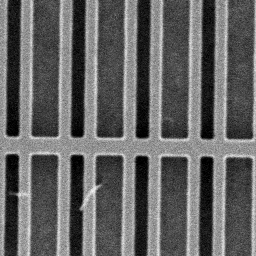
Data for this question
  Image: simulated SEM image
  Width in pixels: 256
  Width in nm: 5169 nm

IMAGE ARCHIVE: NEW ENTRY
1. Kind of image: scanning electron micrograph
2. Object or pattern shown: groups of lines, slits or small figures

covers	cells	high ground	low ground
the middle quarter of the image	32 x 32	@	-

@@---@@@-------@@@----@@-------@
@@---@@@-------@@@----@@-------@
@@---@@@-------@@@----@@-------@
@@---@@@-------@@@----@@-------@
@@---@@@-------@@@----@@-------@
@@---@@@-------@@@----@@-------@
@@---@@@-------@@@----@@-------@
@@---@@@-------@@@----@@-------@
@@---@@@-------@@@----@@-------@
@----@@@-------@@@----@@-------@
@----@@@-------@@@----@@-------@
@----@@@-------@@@----@@-------@
@----@@@-------@@@----@@-------@
@----@@@-------@@@---@@@-------@
@----@@@-------@@@---@@@-------@
@----@@@-------@@@---@@@-------@
@----@@@-------@@@---@@@-------@
@----@@@-------@@@---@@@-------@
@@@@@@@@@------@@@---@@@-------@
@@@@@@@@@@@@@@@@@@@@@@@@@@@@@@@@
@@@@@@@@@@@@@@@@@@@@@@@@@@@@@@@@
@@@@@@@@@@@@@@@@@@@@@@@@@@@@@@@@
@@--@@@@@-----@@@@@@@@@@@@@@@@@@
@----@@@-------@@@---@@@-------@
@----@@@-------@@@---@@@-------@
@----@@@-------@@@---@@@-------@
@----@@@-------@@----@@@-------@
@----@@@-------@@----@@@-------@
@----@@@-------@@----@@@-------@
@----@@@-------@@----@@@-------@
@----@@@-------@@----@@@-------@
@----@@@-------@@----@@@-------@